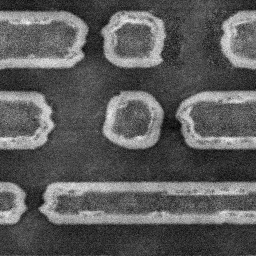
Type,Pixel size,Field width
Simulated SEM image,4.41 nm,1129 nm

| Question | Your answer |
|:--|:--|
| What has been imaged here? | one or a few lines or trenches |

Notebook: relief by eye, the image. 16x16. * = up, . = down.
................
*****..***....**
*****..***....**
*****..***....**
................
................
***....***..****
***....***.*****
***....***..****
................
................
................
*..*************
*..*************
................
................